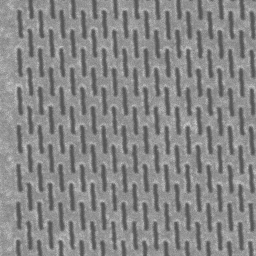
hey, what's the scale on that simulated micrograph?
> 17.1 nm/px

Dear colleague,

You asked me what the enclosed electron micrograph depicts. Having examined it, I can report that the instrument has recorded a regular array of holes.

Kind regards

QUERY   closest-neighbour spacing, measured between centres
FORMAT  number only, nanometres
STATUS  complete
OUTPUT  360